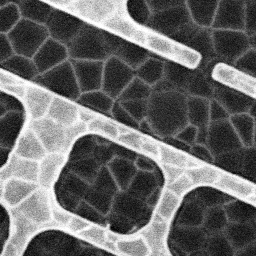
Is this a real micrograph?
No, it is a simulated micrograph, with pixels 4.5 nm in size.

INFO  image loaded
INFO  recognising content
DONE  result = one or a few lines or trenches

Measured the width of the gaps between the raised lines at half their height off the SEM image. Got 362 nanometers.